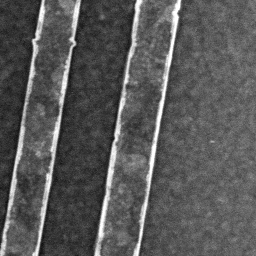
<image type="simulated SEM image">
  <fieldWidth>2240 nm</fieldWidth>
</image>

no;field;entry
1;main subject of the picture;one or a few lines or trenches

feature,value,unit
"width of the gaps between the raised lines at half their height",515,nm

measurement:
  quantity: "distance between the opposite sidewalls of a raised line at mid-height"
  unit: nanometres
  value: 347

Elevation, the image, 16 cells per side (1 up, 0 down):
0001100001100000
0011100011100000
0011100011100000
0011000011100000
0011000011000000
0011000011000000
0011000011000000
0111000111000000
0111000111000000
0110000111000000
0110000110000000
0110000110000000
0110000110000000
1110001110000000
1110001110000000
1100001110000000